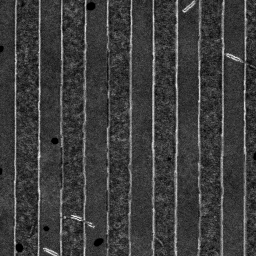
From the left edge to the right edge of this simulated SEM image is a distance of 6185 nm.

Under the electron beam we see wiring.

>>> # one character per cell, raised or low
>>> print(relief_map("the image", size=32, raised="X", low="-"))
--XXX---XXX--XXX---XXX---XXX---X
--XXX---XXX--XXX---XXX---XXX---X
--XXX---XXX--XXX---XXX---XXX---X
--XXX---XXX--XXX---XXX---XXX---X
--XXX---XXX---XX---XXX---XXX---X
--XXX---XXX---XX---XXX---XXX---X
--XXX---XXX---XX---XXX---XXX---X
--XXX---XXX---XX---XXX---XXX---X
--XXX---XXX---XX---XXX---XXX---X
--XXX---XXX---XX---XXX---XXX---X
--XXX---XXX---XX---XXX---XXX---X
--XXX---XXX---XX---XXX---XXX---X
--XXX---XXX---XX---XXX---XXX---X
--XXX---XXX---XX---XXX---XXX---X
--XXX---XXX---XX---XXX---XXX---X
--XXX---XXX---XX---XXX---XXX---X
--XXX---XXX---XX---XXX---XXX---X
--XXX---XXX---XX---XXX---XXX---X
--XXX---XX----XX---XXX---XXX---X
--XXX---XX----XX---XXX---XXX---X
--XXX---XX----XX---XXX---XXX---X
--XXX---XXX---XX---XXX---XXX---X
--XXX---XXX---XX---XXX---XXX---X
--XXX---XXX---XX---XXX---XXX---X
--XXX---XXX---XX---XXX---XXX---X
--XXX---XXX---XX---XXX---XXX---X
--XXX---XXX---XX---XXX---XXX---X
--XXX---XXX---XX---XXX---XXX---X
--XXX---XXX---XX---XXX---XXX---X
--XXX---XXX---XX---XXX---XXX---X
--XXX---XXX---XX---XXX---XXX---X
--XXX---XXX--XXX---XXX---XXX---X